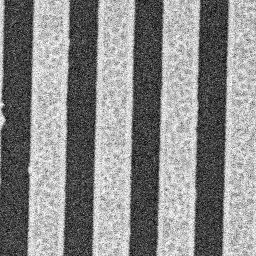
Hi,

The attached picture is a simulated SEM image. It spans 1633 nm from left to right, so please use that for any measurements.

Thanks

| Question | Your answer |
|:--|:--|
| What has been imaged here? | one or a few lines or trenches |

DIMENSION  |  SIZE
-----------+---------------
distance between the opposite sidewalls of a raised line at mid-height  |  31.1 pixels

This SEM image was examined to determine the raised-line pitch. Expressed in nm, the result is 414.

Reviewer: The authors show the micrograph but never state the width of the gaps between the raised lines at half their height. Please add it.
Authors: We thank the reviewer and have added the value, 34 px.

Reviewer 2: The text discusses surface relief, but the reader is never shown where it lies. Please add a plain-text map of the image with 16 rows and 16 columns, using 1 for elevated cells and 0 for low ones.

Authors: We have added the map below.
0011001100110011
0011001100110011
0011001100110011
0011001100110011
0011001100110011
0011001100110011
0011001100110011
0011001100110011
0011001100110011
0011001100110011
0011001100110011
0011001100110011
0011001100110011
0011001100110011
0011001100110011
0011001100110011